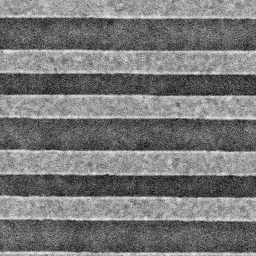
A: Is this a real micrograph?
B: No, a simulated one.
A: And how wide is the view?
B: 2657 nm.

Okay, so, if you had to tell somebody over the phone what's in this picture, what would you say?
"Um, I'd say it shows lines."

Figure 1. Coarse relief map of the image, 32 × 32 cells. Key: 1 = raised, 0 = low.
11111111111111111111111111111111
11111111111111111111111111111111
00000000000000000000000000000000
00000000000000000000000000000000
00000000000000000000000000000000
00000000000000000000000000000000
11111111111111111111111111111111
11111111111111111111111111111111
11111111111111111111111111111111
00000000000000000000000000000000
00000000000000000000000000000000
00000000000000000000000000000000
11111111111111111111111111111111
11111111111111111111111111111111
11111111111111111111111111111111
00000000000000000000000000000000
00000000000000000000000000000000
00000000000000000000000000000000
00000000000000000000000000000000
11111111111111111111111111111111
11111111111111111111111111111111
11111111111111111111111111111111
00000000000000000000000000000000
00000000000000000000000000000000
00000000000000000000000000000000
11111111111111111111111111111111
11111111111111111111111111111111
00000000000000000000000100011111
00000000000000000000000000000000
00000000000000000000000000000000
00000000000000000000000000000000
00000000000000000000000000000000